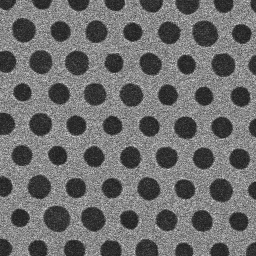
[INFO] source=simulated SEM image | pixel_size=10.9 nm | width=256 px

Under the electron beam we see a regular array of holes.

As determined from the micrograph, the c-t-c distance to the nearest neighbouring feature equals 35.9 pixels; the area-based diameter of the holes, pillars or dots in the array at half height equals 0.238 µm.